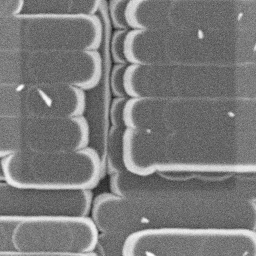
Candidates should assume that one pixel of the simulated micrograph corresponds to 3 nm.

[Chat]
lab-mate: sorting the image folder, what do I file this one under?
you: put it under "wiring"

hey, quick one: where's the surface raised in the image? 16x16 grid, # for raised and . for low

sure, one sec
######..########
######..########
######..########
######..########
######..########
#####...########
#####...########
#####...########
#####...########
######..########
######..########
.#####..........
................
................
######...#######
######..########